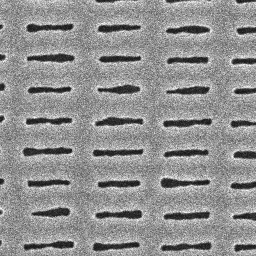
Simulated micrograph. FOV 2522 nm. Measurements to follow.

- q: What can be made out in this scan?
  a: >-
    a regular array of holes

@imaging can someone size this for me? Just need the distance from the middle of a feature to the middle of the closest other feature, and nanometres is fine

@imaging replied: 303